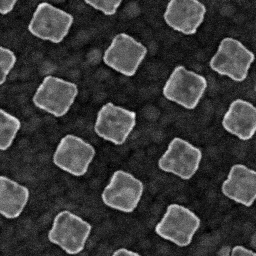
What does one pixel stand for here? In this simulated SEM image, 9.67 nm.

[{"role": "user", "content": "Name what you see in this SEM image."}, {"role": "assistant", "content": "a regular array of raised bodies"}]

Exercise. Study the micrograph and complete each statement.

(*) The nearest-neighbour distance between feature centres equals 602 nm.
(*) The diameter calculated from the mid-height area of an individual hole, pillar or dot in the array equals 362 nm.